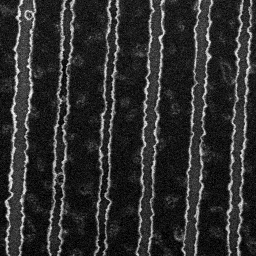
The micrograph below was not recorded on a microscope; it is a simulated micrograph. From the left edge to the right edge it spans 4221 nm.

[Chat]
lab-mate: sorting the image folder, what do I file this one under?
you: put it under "parallel lines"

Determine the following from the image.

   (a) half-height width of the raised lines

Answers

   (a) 570 nanometers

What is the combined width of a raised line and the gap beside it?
726 nm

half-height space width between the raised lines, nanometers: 158